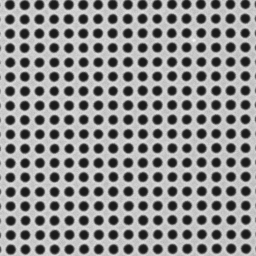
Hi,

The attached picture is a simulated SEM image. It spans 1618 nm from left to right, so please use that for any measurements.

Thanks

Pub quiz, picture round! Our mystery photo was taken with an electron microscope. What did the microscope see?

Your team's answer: a regular array of holes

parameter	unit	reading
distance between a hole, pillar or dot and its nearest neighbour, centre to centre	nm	89.7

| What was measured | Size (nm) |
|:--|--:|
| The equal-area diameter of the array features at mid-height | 59.3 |